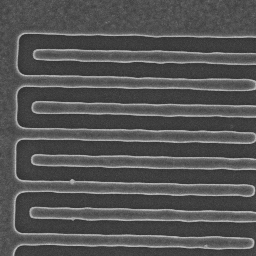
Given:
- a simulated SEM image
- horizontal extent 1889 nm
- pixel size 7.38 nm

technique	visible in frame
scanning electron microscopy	groups of lines, slits or small figures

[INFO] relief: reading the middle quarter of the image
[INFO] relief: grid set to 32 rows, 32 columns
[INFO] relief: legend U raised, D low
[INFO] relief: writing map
DDDDDDDDDDDDDDDDDDDDDDDDDDDDDDDD
DDDDDDDDDDDDDDDDDDDDDDDDDDDDDDDD
DDDDDDDDDDDDDDDDDDDDDDDDDDDDDDDD
UUUUUUUUUUUUUUUUDDDDDDDDDDDDDDDD
UUUUUUUUUUUUUUUUUUUUUUUUUUUUUUUU
UUUUUUUUUUUUUUUUUUUUUUUUUUUUUUUU
DDDDDDDDDDDDDDDDDDDDDDDDDDDDDDDD
DDDDDDDDDDDDDDDDDDDDDDDDDDDDDDDD
DDDDDDDDDDDDDDDDDDDDDDDDDDDDDDDD
DDDDDDDDDDDDDDDDDDDDDDDDDDDDDDDD
UUUUUUUUUUUUUUUUUUUUUUUUUUUUUUUU
UUUUUUUUUUUUUUUUUUUUUUUUUUUUUUUU
DDDDDDDDDDDDDDDDDUUUUUUUUUUUUUUU
DDDDDDDDDDDDDDDDDDDDDDDDDDDDDDDD
DDDDDDDDDDDDDDDDDDDDDDDDDDDDDDDD
DDDDDDDDDDDDDDDDDDDDDDDDDDDDDDDD
UUUUUUUDDDDDDDDDDDDDDDDDDDDDDDDD
UUUUUUUUUUUUUUUUUUUUUUUUUUUUUUUU
UUUUUUUUUUUUUUUUUUUUUUUUUUUUUUUU
DDDDDDDDDDDDDDDDDDDDDDDDDDDDDDDD
DDDDDDDDDDDDDDDDDDDDDDDDDDDDDDDD
DDDDDDDDDDDDDDDDDDDDDDDDDDDDDDDD
DDDDDDDDDDDDDDDDDDDDDDDDDDDDDDDD
UUUUUUUUUUUUUUUUUUUUUUUUUUDDDDDD
UUUUUUUUUUUUUUUUUUUUUUUUUUUUUUUU
DDDDDDDDDDUUUUUUUUUUUUUUUUUUUUUU
DDDDDDDDDDDDDDDDDDDDDDDDDDDDDDDD
DDDDDDDDDDDDDDDDDDDDDDDDDDDDDDDD
DDDDDDDDDDDDDDDDDDDDDDDDDDDDDDDD
UUUUUDDDDDDDDDDDDDDDDDDDDDDDDDDD
UUUUUUUUUUUUUUUUUUUUUUUUUUUUUUUU
UUUUUUUUUUUUUUUUUUUUUUUUUUUUUUUU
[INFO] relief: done